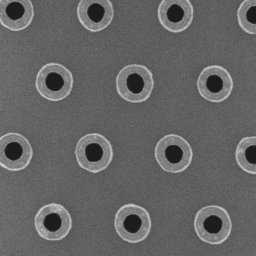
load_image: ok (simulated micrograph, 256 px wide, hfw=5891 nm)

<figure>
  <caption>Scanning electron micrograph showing a regular array of ring-shaped raised bodies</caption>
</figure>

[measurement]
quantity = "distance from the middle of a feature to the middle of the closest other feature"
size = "1830 nm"